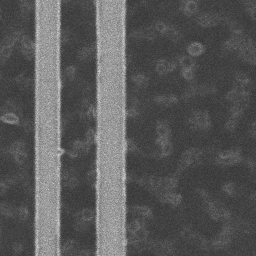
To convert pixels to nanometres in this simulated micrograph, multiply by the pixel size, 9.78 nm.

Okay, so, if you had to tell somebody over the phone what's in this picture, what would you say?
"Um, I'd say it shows one or a few lines or trenches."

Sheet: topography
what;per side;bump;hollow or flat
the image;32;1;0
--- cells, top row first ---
11111001111100001111111111111111
11111001111100001111111111111111
11111001111100001111111111111111
11111001111100001111111111111111
11111001111100001111111111111111
11111001111100001111111111111111
11111001111100001111111111111111
11111001111100001111111111111111
11111001111100001111111111111111
11111001111100001111111111111111
11111001111100001111111111111111
11111001111100001111111111111111
11111001111100001111111111111111
11111001111100001111111111111111
11111001111100001111111111111111
11111001111100001111111111111111
11111001111100001111111111111111
11111001111100001111111111111111
11111001111100001111111111111111
11111001111100001111111111111111
11111001111100001111111111111111
11111001111100001111111111111111
11111001111100001111111111111111
11111001111100001111111111111111
11111001111100001111111111111111
11111001111100001111111111111111
11111001111100001111111111111111
11111001111100001111111111111111
11111001111100001111111111111111
11111001111100001111111111111111
11111001111100001111111111111111
11111001111100001111111111111111